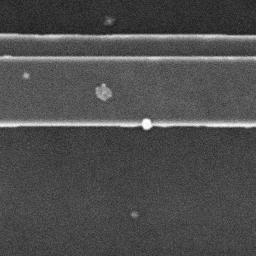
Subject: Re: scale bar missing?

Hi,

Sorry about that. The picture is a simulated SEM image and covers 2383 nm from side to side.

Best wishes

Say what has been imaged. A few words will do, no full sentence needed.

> lines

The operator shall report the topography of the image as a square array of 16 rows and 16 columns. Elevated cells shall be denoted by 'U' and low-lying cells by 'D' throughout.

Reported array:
DDDDDDDDDDDDDDDD
DDDDDDDDDDDDDDDD
UUUUUUUUUUUUUUUU
UUUUUUUUUUUUUUUU
UUUUUUUUUUUUUUUU
UUUUUUUUUUUUUUUU
UUUUUUUUUUUUUUUU
UUUUUUUUUUUUUUUU
DDDDDDDDDDDDDDDD
DDDDDDDDDDDDDDDD
DDDDDDDDDDDDDDDD
DDDDDDDDDDDDDDDD
DDDDDDDDDDDDDDDD
DDDDDDDDDDDDDDDD
DDDDDDDDDDDDDDDD
DDDDDDDDDDDDDDDD